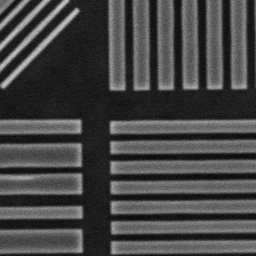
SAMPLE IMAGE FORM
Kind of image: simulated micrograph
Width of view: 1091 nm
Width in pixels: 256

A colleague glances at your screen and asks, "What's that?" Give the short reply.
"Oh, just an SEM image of groups of lines, slits or small figures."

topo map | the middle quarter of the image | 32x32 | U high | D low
DDDDDDDDDDDUUUUDDDUUUDDDUUUDDDUU
DDDDDDDDDDDUUUUDDDUUUDDDUUUDDDUU
DDDDDDDDDDDUUUUDDDUUUDDDUUUDDDUU
DDDDDDDDDDDUUUUDDDUUUDDDUUUDDDUU
DDDDDDDDDDDUUUUDDDUUUDDDUUUDDDUU
DDDDDDDDDDDUUUUDDDUUUDDDUUUDDDUU
DDDDDDDDDDDDDDDDDDDDDDDDDDDDDDDD
DDDDDDDDDDDDDDDDDDDDDDDDDDDDDDDD
DDDDDDDDDDDDDDDDDDDDDDDDDDDDDDDD
DDDDDDDDDDDDDDDDDDDDDDDDDDDDDDDD
DDDDDDDDDDDDDDDDDDDDDDDDDDDDDDDD
DDDDDDDDDDDDDDDDDDDDDDDDDDDDDDDD
DDDDDDDDDDDDDDDDDDDDDDDDDDDDDDDD
DDDDDDDDDDDDDDDDDDDDDDDDDDDDDDDD
UUUUDDDDDDDDUUUUUUUUUUUUUUUUUUUU
UUUUDDDDDDDDUUUUUUUUUUUUUUUUUUUU
UUUUDDDDDDDDUUUUUUUUUUUUUUUUUUUU
DDDDDDDDDDDDDDDDDDDDDDDDDDDDDDDD
DDDDDDDDDDDDDDDDDDDDDDDDDDDDDDDD
DDDDDDDDDDDDUUUUUUUUUUUUUUUUUUUU
UUUUDDDDDDDDUUUUUUUUUUUUUUUUUUUU
UUUUDDDDDDDDUUUUUUUUUUUUUUUUUUUU
UUUUDDDDDDDDDDDDDDDDDDDDDDDDDDDD
UUUUDDDDDDDDDDDDDDDDDDDDDDDDDDDD
UUUUDDDDDDDDUUUUUUUUUUUUUUUUUUUU
UUUUDDDDDDDDUUUUUUUUUUUUUUUUUUUU
DDDDDDDDDDDDUUUUUUUUUUUUUUUUUUUU
UUUUDDDDDDDDDDDDDDDDDDDDDDDDDDDD
UUUUDDDDDDDDDDDDDDDDDDDDDDDDDDDD
UUUUDDDDDDDDUUUUUUUUUUUUUUUUUUUU
UUUUDDDDDDDDUUUUUUUUUUUUUUUUUUUU
UUUUDDDDDDDDUUUUUUUUUUUUUUUUUUUU